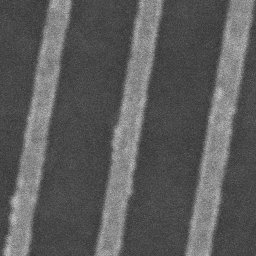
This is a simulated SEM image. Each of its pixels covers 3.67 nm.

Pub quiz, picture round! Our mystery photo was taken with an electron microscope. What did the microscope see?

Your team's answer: one or a few lines or trenches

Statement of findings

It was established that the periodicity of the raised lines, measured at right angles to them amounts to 330 nm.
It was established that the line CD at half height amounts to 0.0772 µm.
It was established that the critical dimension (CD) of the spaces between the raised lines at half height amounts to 67.8 pixels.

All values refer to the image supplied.